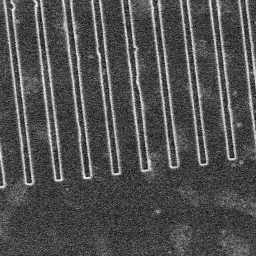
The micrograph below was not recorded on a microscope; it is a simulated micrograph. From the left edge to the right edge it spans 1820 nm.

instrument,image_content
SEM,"parallel lines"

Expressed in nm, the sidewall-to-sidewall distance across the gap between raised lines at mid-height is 40.6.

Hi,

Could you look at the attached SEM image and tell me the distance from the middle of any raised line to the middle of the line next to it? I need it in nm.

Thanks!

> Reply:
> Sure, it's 207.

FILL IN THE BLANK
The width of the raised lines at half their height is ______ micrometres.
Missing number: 0.166